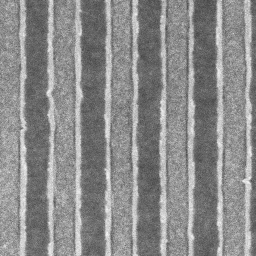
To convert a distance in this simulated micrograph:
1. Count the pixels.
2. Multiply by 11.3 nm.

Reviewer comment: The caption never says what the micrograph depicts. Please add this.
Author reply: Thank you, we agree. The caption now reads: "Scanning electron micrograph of parallel lines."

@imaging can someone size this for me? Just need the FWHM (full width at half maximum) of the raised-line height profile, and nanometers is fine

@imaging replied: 336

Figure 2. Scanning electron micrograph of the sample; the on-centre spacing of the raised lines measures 637 nanometres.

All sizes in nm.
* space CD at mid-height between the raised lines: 305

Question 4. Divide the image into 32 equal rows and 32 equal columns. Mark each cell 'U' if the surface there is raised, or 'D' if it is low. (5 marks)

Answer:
DDDUUUDDDDUUUUDDDUUUUDDDUUUUDDDU
DDDUUUDDDDUUUDDDDUUUUDDDUUUDDDDU
DDDUUUDDDDUUUUDDDUUUUDDDUUUDDDDU
DDDUUUDDDDUUUUDDDUUUDDDDUUUDDDDU
DDDUUUDDDDUUUUDDDUUUDDDDUUUDDDDU
DDDUUUDDDDUUUUDDDUUUDDDDUUUDDDDU
DDDUUUDDDDUUUUDDDUUUDDDDUUUDDDDU
DDDUUUDDDDUUUUDDDUUUDDDDUUUDDDDU
DDDUUUDDDDUUUUDDDUUUDDDDUUUDDDDU
DDDUUUDDDDUUUUDDDUUUDDDDUUUUDDDU
DDDUUUDDDDUUUUDDDUUUUDDDUUUUDDDU
DDDUUUDDDDUUUDDDDUUUUDDDUUUUDDDU
DDDUUUDDDDUUUDDDDUUUUDDDUUUUDDDU
DDDUUUDDDDUUUDDDDUUUUDDDUUUUDDDU
DDDUUUDDDDUUUUDDDUUUDDDDUUUUDDDU
DDDUUUUDDDUUUDDDDUUUDDDDUUUUDDDU
DDDUUUUDDDUUUDDDDUUUDDDDUUUUDDDU
DDDUUUDDDDUUUDDDDUUUDDDDUUUUDDDU
DDDUUUDDDDUUUDDDDUUUDDDDUUUUDDDU
DDDUUUDDDDUUUDDDDUUUDDDDUUUUDDDU
DDDUUUDDDDUUUDDDDUUUDDDDUUUUDDDU
DDDUUUDDDDUUUUDDDUUUDDDDUUUDDDDU
DDDUUUDDDDUUUUDDDUUUDDDDUUUDDDDU
DDDUUUDDDDUUUUDDDUUUDDDDUUUDDDDU
DDDUUUDDDDUUUUDDDUUUUDDDUUUDDDDU
DDDUUUDDDDUUUUDDDUUUUDDDUUUUDDDU
DDDUUUDDDDUUUUDDDUUUUDDDUUUUDDDU
DDDUUUDDDDUUUUDDDUUUDDDDUUUUDDDU
DDDUUUDDDDUUUUDDDUUUDDDDUUUUDDDU
DDDUUUDDDDUUUDDDDUUUUDDDUUUUDDDU
DDDUUUDDDDUUUDDDDUUUUDDDUUUUDDDU
DDDUUUDDDDUUUDDDDUUUDDDDUUUUDDDU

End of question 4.